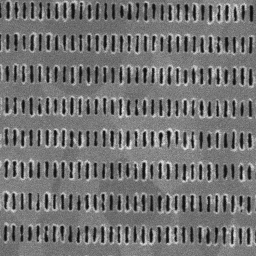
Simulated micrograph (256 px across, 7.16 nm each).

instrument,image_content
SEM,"a regular array of holes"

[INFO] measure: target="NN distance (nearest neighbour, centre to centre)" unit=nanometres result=57.4